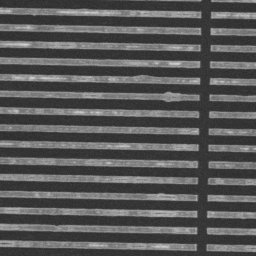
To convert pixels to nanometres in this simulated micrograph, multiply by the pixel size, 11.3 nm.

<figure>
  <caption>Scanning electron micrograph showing parallel lines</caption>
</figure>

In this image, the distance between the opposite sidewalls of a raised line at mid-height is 0.0707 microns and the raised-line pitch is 0.188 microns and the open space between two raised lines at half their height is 0.122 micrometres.